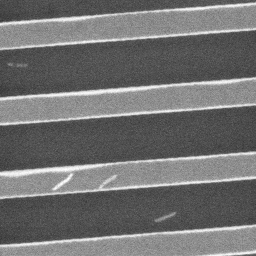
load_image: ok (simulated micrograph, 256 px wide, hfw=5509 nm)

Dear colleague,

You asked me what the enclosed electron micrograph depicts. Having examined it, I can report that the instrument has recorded lines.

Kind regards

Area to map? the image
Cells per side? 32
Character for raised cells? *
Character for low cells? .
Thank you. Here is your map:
...............................*
..................**************
.....***************************
********************************
*********************...........
********........................
................................
................................
................................
................................
.......................*********
..........**********************
********************************
***************************.....
**************..................
*...............................
................................
................................
................................
..........................******
.............*******************
..******************************
*****************************...
****************................
***.............................
................................
................................
................................
............................****
...............*****************
...*****************************
********************************